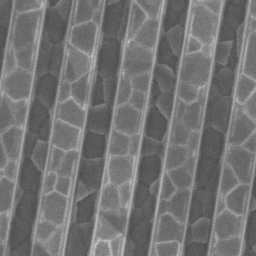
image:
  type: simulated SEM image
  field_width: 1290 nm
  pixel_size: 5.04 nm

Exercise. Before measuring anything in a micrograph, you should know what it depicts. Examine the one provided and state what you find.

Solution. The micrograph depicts parallel lines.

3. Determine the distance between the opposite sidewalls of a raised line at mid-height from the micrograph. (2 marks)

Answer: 0.16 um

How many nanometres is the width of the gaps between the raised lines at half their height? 132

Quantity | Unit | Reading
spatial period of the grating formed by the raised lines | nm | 293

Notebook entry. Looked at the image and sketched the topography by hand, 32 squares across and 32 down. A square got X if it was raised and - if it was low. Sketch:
--XXXX---XXXX---XXXX----XXXX---X
--XXXX---XXXX---XXXX----XXXX---X
-XXXX----XXXX---XXXX---XXXX----X
-XXXX----XXXX---XXXX---XXXX----X
-XXXX---XXXX----XXXX---XXXX---XX
-XXXX---XXXX----XXXX---XXXX---XX
-XXXX---XXXX---XXXX----XXXX---XX
-XXXX---XXXX---XXXX----XXXX---XX
XXXX----XXXX---XXXX---XXXX----XX
XXXX----XXXX---XXXX---XXXX----XX
XXXX---XXXX----XXXX---XXXX----XX
XXXX---XXXX----XXXX---XXXX---XXX
XXXX---XXXX---XXXX----XXXX---XXX
XXXX---XXXX---XXXX----XXXX---XXX
XXX----XXXX---XXXX---XXXXX---XXX
XXX----XXXX---XXXX---XXXX----XXX
XXX---XXXX----XXXX---XXXX----XXX
XXX---XXXX----XXXX---XXXX---XXXX
XXX---XXXX---XXXX----XXXX---XXXX
XXX---XXXX---XXXX----XXXX---XXXX
XX----XXXX---XXXX----XXXX---XXXX
XX----XXXX---XXXX---XXXX----XXXX
XX---XXXX----XXXX---XXXX----XXXX
XX---XXXX----XXXX---XXXX---XXXX-
XX---XXXX---XXXXX---XXXX---XXXX-
XX---XXXX---XXXX----XXXX---XXXX-
X----XXXX---XXXX----XXXX---XXXX-
X----XXXX---XXXX---XXXX----XXXX-
X---XXXX----XXXX---XXXX----XXXX-
X---XXXX----XXXX---XXXX---XXXX--
X---XXXX----XXXX---XXXX---XXXX--
X---XXXX---XXXX----XXXX---XXXX--